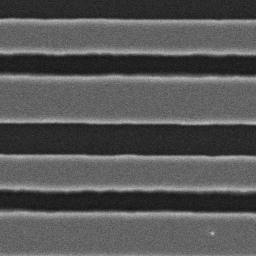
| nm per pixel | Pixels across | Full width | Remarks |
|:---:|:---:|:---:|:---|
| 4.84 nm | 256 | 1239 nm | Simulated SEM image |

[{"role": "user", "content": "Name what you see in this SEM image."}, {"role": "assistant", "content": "lines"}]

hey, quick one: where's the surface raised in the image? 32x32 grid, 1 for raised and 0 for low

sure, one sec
00000000000000000000000000000000
00000000000000000000000000000000
11111000011111000000000000000000
11111111111111111111111111111111
11111111111111111111111111111111
11111111111111111111111111111111
11111111111111111111111111111111
00000000000000000000000000000000
00000000000000000000000000000000
00000000000000000000000000000000
11111111111111111111111111111111
11111111111111111111111111111111
11111111111111111111111111111111
11111111111111111111111111111111
11111111111111111111111111111111
00000000000000000000001111100001
00000000000000000000000000000000
00000000000000000000000000000000
00000000000000000000000000000000
11111111111000011000000000000000
11111111111111111111111111111111
11111111111111111111111111111111
11111111111111111111111111111111
11111111111111111111111111111111
00000000000000000000000000000000
00000000000000000000000000000000
00000000000000000000000000000000
11111111111111111111111111111111
11111111111111111111111111111111
11111111111111111111111111111111
11111111111111111111111111111111
11111111111111111111111111111111